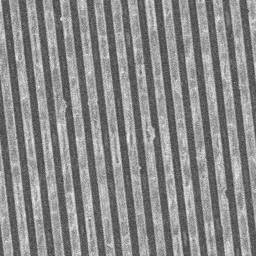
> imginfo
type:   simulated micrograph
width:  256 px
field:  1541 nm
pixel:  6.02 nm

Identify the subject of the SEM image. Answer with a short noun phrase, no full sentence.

parallel lines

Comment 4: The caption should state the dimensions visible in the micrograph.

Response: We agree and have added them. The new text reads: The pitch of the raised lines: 0.102 µm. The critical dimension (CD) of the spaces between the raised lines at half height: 51.5 nanometers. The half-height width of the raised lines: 51.5 nanometers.